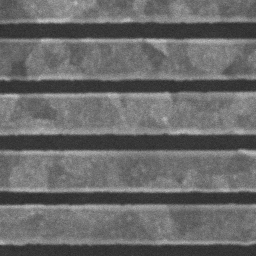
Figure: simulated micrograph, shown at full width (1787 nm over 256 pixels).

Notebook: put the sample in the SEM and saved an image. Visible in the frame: lines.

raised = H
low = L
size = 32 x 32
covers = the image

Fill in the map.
HHHHHHHHHHHHHHHHHHHHHHHHHHHHHHHH
HHHHHHHHHHHHHHHHHHHHHHHHHHHHHHHH
HHHHHHHHHHHHHLLLLLLLLLLLLLLLLLLL
LLLLLLLLLLLLLLLLLLLLLLLLLLLLLLLL
LLLLLLLLLLLLLLLLLLLLLLLLLLLLLLLL
HHHHHHHHHHHHHHHHHHHHHHHHHHHHHHHH
HHHHHHHHHHHHHHHHHHHHHHHHHHHHHHHH
HHHHHHHHHHHHHHHHHHHHHHHHHHHHHHHH
HHHHHHHHHHHHHHHHHHHHHHHHHHHHHHHH
HHHHHHHHHHHHHHHHHHHHHHHHHHHHHHHH
LLLLLLLLLLLLLLLLLLLLLLLLLLLLLLLL
LLLLLLLLLLLLLLLLLLLLLLLLLLLLLLLL
HHHHHHHHHHHHHHHHHHHHHHHHHHHHHHHH
HHHHHHHHHHHHHHHHHHHHHHHHHHHHHHHH
HHHHHHHHHHHHHHHHHHHHHHHHHHHHHHHH
HHHHHHHHHHHHHHHHHHHHHHHHHHHHHHHH
HHHLLLHLLLLLLLLLHLLLLHHLHHLHHLLH
LLLLLLLLLLLLLLLLLLLLLLLLLLLLLLLL
LLLLLLLLLLLLLLLLLLLLLLLLLLLLLLLL
HHHHHHHHHHHHHHHHHHHHHHHHHHHHHHHH
HHHHHHHHHHHHHHHHHHHHHHHHHHHHHHHH
HHHHHHHHHHHHHHHHHHHHHHHHHHHHHHHH
HHHHHHHHHHHHHHHHHHHHHHHHHHHHHHHH
HHHHHHHHHHHHHHHHHHHHHHHHHHHHHHHH
LLLLLLLLLLLLLLLLLLLLLLLLLLLLLLLL
LLLLLLLLLLLLLLLLLLLLLLLLLLLLLLLL
HHHHHHHHHHHHHHHHHHHHHHHHHHHHHHHH
HHHHHHHHHHHHHHHHHHHHHHHHHHHHHHHH
HHHHHHHHHHHHHHHHHHHHHHHHHHHHHHHH
HHHHHHHHHHHHHHHHHHHHHHHHHHHHHHHH
LLLLLLLLLLLLLLLLLLLLLLLLLLLLLLLL
LLLLLLLLLLLLLLLLLLLLLLLLLLLLLLLL